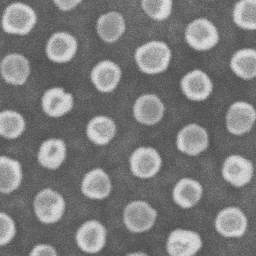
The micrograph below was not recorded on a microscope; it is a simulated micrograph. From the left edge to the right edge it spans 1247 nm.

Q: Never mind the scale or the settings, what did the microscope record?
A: a regular array of raised bodies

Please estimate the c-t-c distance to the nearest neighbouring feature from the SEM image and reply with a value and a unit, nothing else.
250 nanometers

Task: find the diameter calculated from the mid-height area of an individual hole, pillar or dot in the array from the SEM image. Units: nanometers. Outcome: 141